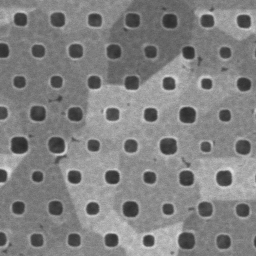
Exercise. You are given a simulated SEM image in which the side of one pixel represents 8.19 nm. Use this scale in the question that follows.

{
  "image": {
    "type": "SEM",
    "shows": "a regular array of holes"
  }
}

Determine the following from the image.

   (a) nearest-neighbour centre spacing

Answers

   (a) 297 nm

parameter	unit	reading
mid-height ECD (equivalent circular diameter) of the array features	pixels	14.9